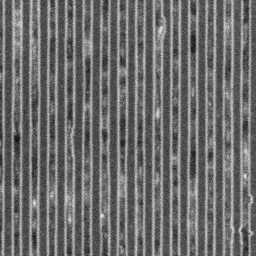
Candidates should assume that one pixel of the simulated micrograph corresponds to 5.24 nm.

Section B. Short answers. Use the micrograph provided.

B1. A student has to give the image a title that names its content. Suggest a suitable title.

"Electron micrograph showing parallel lines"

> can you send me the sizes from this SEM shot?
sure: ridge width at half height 53.1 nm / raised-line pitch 0.0922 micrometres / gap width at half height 40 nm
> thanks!